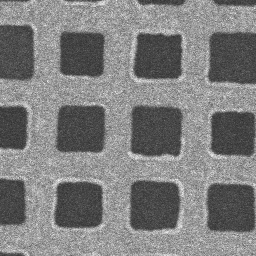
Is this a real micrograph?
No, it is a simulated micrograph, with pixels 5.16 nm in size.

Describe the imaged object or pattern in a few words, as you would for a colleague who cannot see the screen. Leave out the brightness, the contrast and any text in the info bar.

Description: holes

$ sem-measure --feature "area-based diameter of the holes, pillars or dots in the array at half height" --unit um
0.265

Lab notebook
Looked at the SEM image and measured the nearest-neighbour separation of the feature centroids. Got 74.9 pixels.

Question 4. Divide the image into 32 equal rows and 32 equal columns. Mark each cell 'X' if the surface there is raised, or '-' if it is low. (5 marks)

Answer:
XXXXXXXXXXXXXXXXXX-----XXXX-----
XXXXXXXXXXXXXXXXXXXXXXXXXXXXXXXX
XXXXXXXXXXXXXXXXXXXXXXXXXXXXXXXX
----XXXXXXXXXXXXXXXXXXXXXXXXXXXX
----XXXX-----XXXX-----XXXX------
----XXX------XXXX------XXX------
----XXX------XXXX------XXX------
----XXXX-----XXXX------XXX------
----XXXX-----XXXX------XXX------
----XXXXXX--XXXXX-----XXXX------
XXXXXXXXXXXXXXXXXXXXXXXXXXXXXX--
XXXXXXXXXXXXXXXXXXXXXXXXXXXXXXXX
XXXXXXXXXXXXXXXXXXXXXXXXXXXXXXXX
---XXXXX-----XXXX-----XXXXXXXXXX
---XXXX------XXX-------XXX------
---XXXX------XXX-------XXX------
---XXXX------XXX-------XXX------
---XXXX------XXX-------XXX------
---XXXX------XXX-------XXX------
XXXXXXXXXXXXXXXXXX--XXXXXXXXXXXX
XXXXXXXXXXXXXXXXXXXXXXXXXXXXXXXX
XXXXXXXXXXXXXXXXXXXXXXXXXXXXXXXX
--XXXXXXXXXXXXXXXXXXXXXXXXXXXXXX
---XXXX------XXX------XXXX------
---XXXX------XXX------XXXX------
---XXXX------XXX-------XXX------
---XXXX------XXX------XXXX------
---XXXX------XXX------XXXX------
XXXXXXXXXXXXXXXXX-----XXXX------
XXXXXXXXXXXXXXXXXXXXXXXXXXXXXXXX
XXXXXXXXXXXXXXXXXXXXXXXXXXXXXXXX
-XXXXXXXXXXXXXXXXXXXXXXXXXXXXXXX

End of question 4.